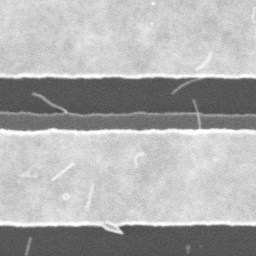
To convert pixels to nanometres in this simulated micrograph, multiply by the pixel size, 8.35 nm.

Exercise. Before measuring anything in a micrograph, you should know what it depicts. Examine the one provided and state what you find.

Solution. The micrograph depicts lines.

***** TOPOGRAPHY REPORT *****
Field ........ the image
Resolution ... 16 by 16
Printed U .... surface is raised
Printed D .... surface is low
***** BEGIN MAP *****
UUUUUUUUUUUUUUUU
UUUUUUUUUUUUUUUU
UUUUUUUUUUUUUUUU
UUUUUUUUUUUUUUUU
UUUUUUUUUUUUUUUU
DDDDDDDDDDDDDDDD
DDDDDDDDDDDDDDDD
DDDDDDDDDDDDDDDD
UUUUUUUUUUUUUUUU
UUUUUUUUUUUUUUUU
UUUUUUUUUUUUUUUU
UUUUUUUUUUUUUUUU
UUUUUUUUUUUUUUUU
UUUUUUUUUUUUUUUU
DDDDDDDDDDDDDDDD
DDDDDDDDDDDDDDDD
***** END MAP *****